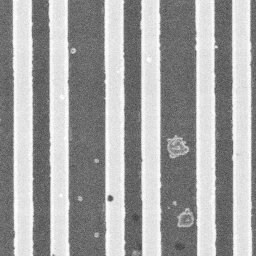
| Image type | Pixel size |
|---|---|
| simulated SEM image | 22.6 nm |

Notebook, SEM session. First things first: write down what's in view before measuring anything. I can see lines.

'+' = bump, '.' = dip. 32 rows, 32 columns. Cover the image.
..++..++.....++...++.....++..++.
..++..++.....++...++.....++..++.
..++..++.....++...++.....++..++.
..++..++.....++...++.....++..++.
..++..++.....++...++.....++..++.
..++..++.....++...++.....++..++.
..++..++.....++...++.....++..++.
..++..++.....++...++.....++..++.
..++..++.....++...++.....++..++.
..++..++.....++...++.....++..++.
..++..++.....++...++.....++..++.
..++..++.....++...++.....++..++.
..++..++.....++...++.....++..++.
..++..++.....++...++.....++..++.
..++..++.....++...++.....++..++.
..++..++.....++...++.....++..++.
..++..++.....++...++.....++..++.
..++..++.....++...++.....++..++.
..++..++.....++...++.....++..++.
..++..++.....++...++.....++..++.
..++..++.....++...++.....++..++.
..++..++.....++...++.....++..++.
..++..++.....++...++.....++..++.
..++..++.....++...++.....++..++.
..++..++.....++...++.....++..++.
..++..++.....++...++.....++..++.
..++..++.....+++..++.....++..++.
..++..++.....++...++.....++..++.
..++..++.....++...++.....++..++.
..++..++.....++...++.....++..++.
..++..++.....++...++.....++..++.
..++..++.....++...++.....++..++.